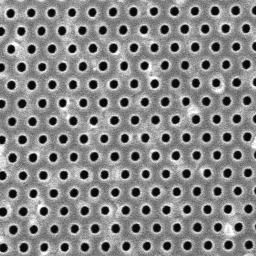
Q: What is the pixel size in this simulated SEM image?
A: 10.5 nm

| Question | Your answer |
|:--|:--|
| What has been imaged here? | a regular array of holes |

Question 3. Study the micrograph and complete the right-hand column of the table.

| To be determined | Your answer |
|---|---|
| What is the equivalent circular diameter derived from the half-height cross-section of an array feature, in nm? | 92.6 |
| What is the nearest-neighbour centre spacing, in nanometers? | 213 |